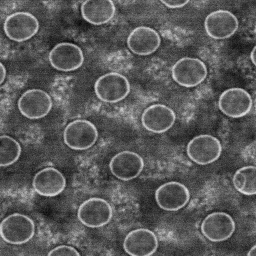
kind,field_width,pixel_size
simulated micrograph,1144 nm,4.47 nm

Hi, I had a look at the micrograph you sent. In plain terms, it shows a regular array of raised bodies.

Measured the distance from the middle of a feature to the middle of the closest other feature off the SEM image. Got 246 nanometres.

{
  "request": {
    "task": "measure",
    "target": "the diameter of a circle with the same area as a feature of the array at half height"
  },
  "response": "135 nm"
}